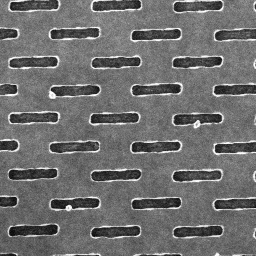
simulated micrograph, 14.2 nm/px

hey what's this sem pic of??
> a regular array of holes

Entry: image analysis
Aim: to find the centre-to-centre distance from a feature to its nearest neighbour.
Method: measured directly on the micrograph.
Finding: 694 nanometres